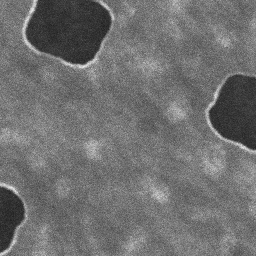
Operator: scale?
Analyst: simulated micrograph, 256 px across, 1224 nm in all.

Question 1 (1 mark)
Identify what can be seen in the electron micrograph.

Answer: holes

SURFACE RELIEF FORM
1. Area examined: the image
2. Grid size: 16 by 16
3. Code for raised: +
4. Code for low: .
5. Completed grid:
++.....+++++++++
++.....+++++++++
++....++++++++++
+++...++++++++++
++++++++++++++++
++++++++++++++..
+++++++++++++...
+++++++++++++...
++++++++++++++..
++++++++++++++++
++++++++++++++++
++++++++++++++++
.+++++++++++++++
..++++++++++++++
.+++++++++++++++
++++++++++++++++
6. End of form